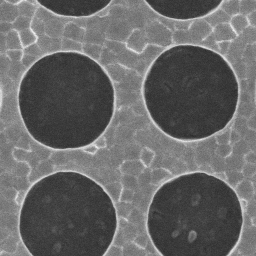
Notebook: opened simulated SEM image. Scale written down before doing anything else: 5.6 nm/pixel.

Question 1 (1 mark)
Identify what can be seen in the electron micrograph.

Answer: holes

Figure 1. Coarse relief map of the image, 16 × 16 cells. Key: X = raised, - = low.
XXX---XXXX---XXX
XXXXXXXXXXXXXXXX
XXXXXXXXXXXXXXXX
XXX--XXXXX----XX
XX-----XX------X
X------XX------X
X------XX------X
X------XXX----XX
XX----XXXXX--XXX
XXXXXXXXXXXXXXXX
XXXXXXXXXXXXXXXX
XX----XXXX----XX
XX-----XXX-----X
X------XX------X
X------XX------X
XX-----XXX-----X